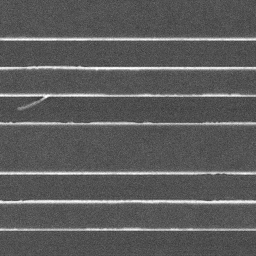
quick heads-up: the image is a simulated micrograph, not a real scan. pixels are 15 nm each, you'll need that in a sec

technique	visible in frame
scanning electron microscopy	lines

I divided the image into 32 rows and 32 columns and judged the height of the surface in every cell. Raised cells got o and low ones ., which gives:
oooooooooooooooooooooooooooooooo
oooooooooooooooooooooooooooooooo
oooooooooooooooooooooooooooooooo
oooooooooooooooooooooooooooooooo
oooooooooooooooooooooooooooooooo
................................
................................
................................
oooooooooooooooooooooooooooooooo
oooooooooooooooooooooooooooooooo
oooooooooooooooooooooooooooooooo
oooooooooooooooooooooooooooooooo
................................
................................
................................
oooooooooooooooooooooooooooooooo
oooooooooooooooooooooooooooooooo
oooooooooooooooooooooooooooooooo
oooooooooooooooooooooooooooooooo
oooooooooooooooooooooooooooooooo
oooooooooooooooooooooooooooooooo
oooooooooooooooooooooooooooooooo
................................
................................
................................
oooooooooooooooooooooooooooooooo
oooooooooooooooooooooooooooooooo
oooooooooooooooooooooooooooooooo
oooooooooooooooooooooooooooooooo
................................
................................
................................